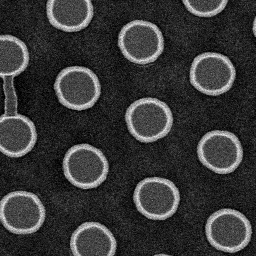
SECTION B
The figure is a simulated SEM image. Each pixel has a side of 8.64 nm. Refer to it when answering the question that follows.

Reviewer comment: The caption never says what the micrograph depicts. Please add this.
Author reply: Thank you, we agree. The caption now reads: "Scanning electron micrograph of a regular array of raised bodies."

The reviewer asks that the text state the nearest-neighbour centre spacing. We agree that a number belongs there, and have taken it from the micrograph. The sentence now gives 674 nm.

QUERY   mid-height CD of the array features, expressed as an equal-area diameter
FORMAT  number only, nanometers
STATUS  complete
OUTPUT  353